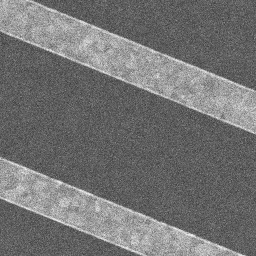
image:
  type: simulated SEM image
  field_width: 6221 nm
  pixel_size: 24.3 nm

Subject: one or a few lines or trenches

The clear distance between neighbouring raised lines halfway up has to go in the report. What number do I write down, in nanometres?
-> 2870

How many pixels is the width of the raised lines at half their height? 37.8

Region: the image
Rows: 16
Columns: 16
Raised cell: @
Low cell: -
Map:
@@@-------------
@@@@@-----------
-@@@@@@@--------
----@@@@@@------
------@@@@@@@---
---------@@@@@@-
-----------@@@@@
--------------@@
----------------
----------------
@---------------
@@@@------------
@@@@@@----------
---@@@@@@-------
-----@@@@@@-----
--------@@@@@@--